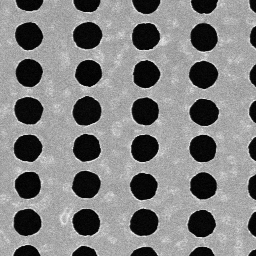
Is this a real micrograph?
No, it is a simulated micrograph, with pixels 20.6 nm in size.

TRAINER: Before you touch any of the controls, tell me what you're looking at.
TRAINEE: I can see a regular array of holes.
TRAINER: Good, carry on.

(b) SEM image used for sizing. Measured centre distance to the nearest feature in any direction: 0.76 micrometres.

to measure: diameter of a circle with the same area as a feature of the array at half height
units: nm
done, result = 566